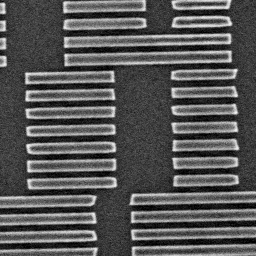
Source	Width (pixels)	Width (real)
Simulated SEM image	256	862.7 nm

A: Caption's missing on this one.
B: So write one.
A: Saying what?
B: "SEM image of wiring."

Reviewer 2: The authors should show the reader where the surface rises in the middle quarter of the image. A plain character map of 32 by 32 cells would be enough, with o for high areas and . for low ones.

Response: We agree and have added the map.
................................
................................
oooooooooooo...............ooooo
oooooooooooo...............ooooo
oooooooo........................
................................
....oooooooo...............ooooo
oooooooooooo...............ooooo
ooooooooooooo...................
................................
............................oooo
oooooooooooo...............ooooo
oooooooooooo...............ooooo
................................
................................
oooooooooooo...............ooooo
ooooooooooooo..............ooooo
oooooooooooo....................
................................
...........................ooooo
ooooooooooooo..............ooooo
ooooooooooooo..............ooooo
................................
................................
ooooooooooooo..............ooooo
ooooooooooooo..............ooooo
oooooooooooo....................
................................
.......ooooo...............ooooo
ooooooooooooo..............ooooo
ooooooooooooo...................
................................